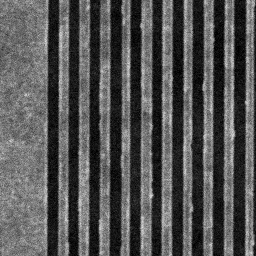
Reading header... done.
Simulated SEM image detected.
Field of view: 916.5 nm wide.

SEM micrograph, parallel lines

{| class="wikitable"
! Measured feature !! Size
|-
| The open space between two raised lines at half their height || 43.8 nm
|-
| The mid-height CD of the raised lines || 30.4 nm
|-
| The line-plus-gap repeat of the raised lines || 74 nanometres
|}